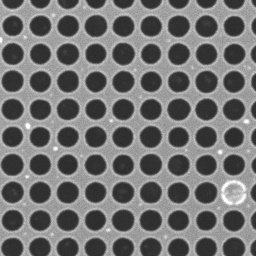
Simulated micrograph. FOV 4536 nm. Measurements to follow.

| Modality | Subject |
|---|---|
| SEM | a regular array of holes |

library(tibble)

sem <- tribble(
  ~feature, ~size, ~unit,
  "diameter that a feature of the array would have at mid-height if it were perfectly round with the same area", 21.9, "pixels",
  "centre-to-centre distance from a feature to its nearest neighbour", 0.487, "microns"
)